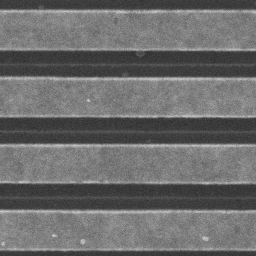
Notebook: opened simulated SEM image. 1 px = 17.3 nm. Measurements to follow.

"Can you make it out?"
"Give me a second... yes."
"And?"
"lines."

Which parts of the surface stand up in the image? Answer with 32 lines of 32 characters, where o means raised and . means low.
................................
oooooooooooooooooooooooooooooooo
oooooooooooooooooooooooooooooooo
oooooooooooooooooooooooooooooooo
oooooooooooooooooooooooooooooooo
oooooooooooooooooooooooooooooooo
................................
................................
................................
................................
oooooooooooooooooooooooooooooooo
oooooooooooooooooooooooooooooooo
oooooooooooooooooooooooooooooooo
oooooooooooooooooooooooooooooooo
oooooooooooooooooooooooooooooooo
................................
................................
................................
oooooooooooooooooooooooooooooooo
oooooooooooooooooooooooooooooooo
oooooooooooooooooooooooooooooooo
oooooooooooooooooooooooooooooooo
oooooooooooooooooooooooooooooooo
................................
................................
................................
oooooooooooooooooooooooooooooooo
oooooooooooooooooooooooooooooooo
oooooooooooooooooooooooooooooooo
oooooooooooooooooooooooooooooooo
oooooooooooooooooooooooooooooooo
................................